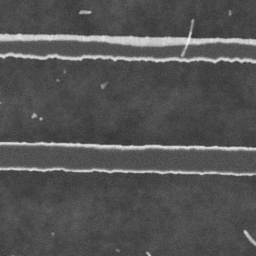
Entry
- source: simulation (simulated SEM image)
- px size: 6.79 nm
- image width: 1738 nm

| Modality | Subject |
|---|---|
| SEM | lines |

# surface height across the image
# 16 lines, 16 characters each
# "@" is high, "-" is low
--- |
----------------
----------------
@@@@@@@@@@@@@@@-
@@@@@@@@@@@@@@@@
----------------
----------------
----------------
----------------
----------------
@@@@@@@@@@@@@@@@
@@@@@@@@@@@@@@@@
----------------
----------------
----------------
----------------
----------------